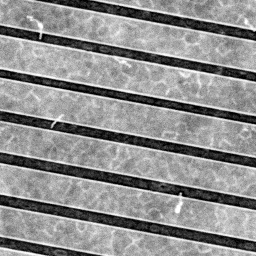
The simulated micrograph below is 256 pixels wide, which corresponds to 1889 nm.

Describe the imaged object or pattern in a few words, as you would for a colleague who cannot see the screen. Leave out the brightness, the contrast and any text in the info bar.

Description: parallel lines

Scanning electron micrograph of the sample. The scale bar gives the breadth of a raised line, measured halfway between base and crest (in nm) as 218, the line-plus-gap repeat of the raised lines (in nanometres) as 307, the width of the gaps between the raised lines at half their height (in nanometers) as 82.5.